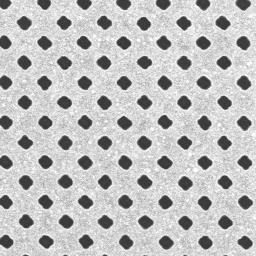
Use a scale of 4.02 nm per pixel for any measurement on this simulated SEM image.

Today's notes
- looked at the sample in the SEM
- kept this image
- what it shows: a regular array of holes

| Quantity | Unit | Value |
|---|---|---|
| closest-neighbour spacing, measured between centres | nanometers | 112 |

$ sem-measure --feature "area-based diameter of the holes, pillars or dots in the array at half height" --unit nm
52.7